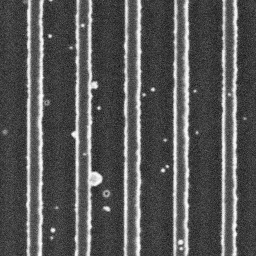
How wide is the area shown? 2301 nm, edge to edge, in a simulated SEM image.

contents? lines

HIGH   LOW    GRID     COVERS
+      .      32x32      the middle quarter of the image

...++++.........+++.........+++.
...++++.........+++.........+++.
...++++........++++.........+++.
...++++.........+++.........+++.
...++++.........+++.........+++.
...++++........++++.........+++.
...++++........++++.........+++.
...++++.........+++.........+++.
...++++.........+++.........+++.
...++++.........+++.........+++.
...++++........++++.........+++.
...++++........++++.........+++.
...++++........++++.........+++.
...++++.........+++.........+++.
...++++.........+++.........+++.
...++++.........+++.........+++.
...++++........++++.........+++.
...++++........++++.........+++.
...++++........++++.........+++.
...++++........++++.........+++.
...++++........++++.........+++.
...++++........++++.........+++.
...++++........++++.........+++.
...++++.........+++.........+++.
...++++........++++.........+++.
...++++.........+++.........+++.
...++++........++++.........+++.
...+++++.......++++.........+++.
...++++++......++++.........+++.
...+++++.......++++.........+++.
...++++........++++.........+++.
...+++.........++++.........+++.